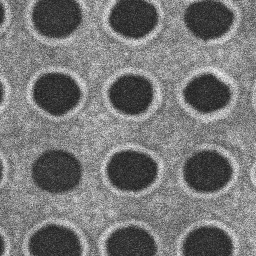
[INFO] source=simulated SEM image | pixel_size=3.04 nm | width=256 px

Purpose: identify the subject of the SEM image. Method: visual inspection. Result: holes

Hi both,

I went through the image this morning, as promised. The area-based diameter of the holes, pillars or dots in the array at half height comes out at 134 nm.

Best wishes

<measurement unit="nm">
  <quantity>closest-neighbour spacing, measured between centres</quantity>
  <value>228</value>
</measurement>